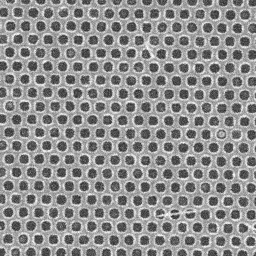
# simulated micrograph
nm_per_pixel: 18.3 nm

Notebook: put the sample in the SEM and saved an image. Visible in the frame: a regular array of holes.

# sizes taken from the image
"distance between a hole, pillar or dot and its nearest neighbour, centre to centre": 14.9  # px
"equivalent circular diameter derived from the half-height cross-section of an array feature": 0.2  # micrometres